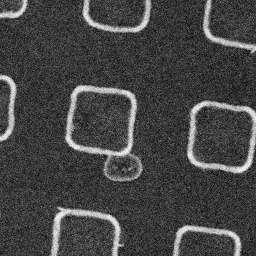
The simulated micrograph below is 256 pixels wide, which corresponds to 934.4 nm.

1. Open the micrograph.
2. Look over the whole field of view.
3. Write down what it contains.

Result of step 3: raised bodies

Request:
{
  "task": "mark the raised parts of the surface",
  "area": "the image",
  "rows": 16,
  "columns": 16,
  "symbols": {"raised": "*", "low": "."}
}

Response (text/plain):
*....****....***
......***....***
..............**
................
................
*...............
*....***........
*...****....****
....****....****
......**....****
..............*.
................
................
....***.........
....***....***..
...****....****.